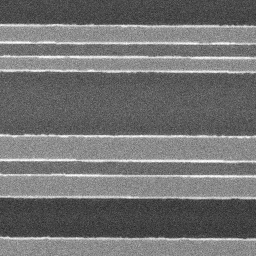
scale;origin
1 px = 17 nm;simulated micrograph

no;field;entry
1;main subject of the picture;lines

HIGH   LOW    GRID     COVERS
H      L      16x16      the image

LLLLLLLLLLLLLLLL
LLLLLLLLLLLLLLLL
HHHHHHHHHHHHHHHH
HHHHHHHHHHHHHHHH
LLLLLLLLLLLHHHHH
LLLLLLLLLLLLLLLL
LLLLLLLLLLLLLLLL
LLLLLLLLLLLLLLLL
HHHHHHHHHLLHLLLL
HHHHHHHHHHHHHHHH
HHHHHHHHHHHHHHHH
HHHHHHHHHHHHHHHH
LLLLLLLLLLLLLLLL
LLLLLLLLLLLLLLLL
LLLLLLLLLLLLLLLL
HHHHHHHHHHHHHHHH